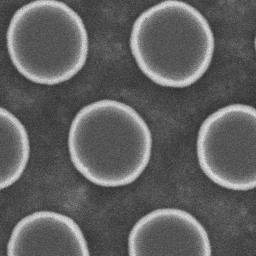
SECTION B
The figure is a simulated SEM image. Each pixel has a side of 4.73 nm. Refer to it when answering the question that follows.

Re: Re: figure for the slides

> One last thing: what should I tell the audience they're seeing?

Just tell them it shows raised bodies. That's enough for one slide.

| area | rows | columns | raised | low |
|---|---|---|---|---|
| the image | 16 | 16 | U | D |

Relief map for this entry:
DDUUDDDDDDUUDDDD
DUUUUDDDDUUUUDDD
DUUUUDDDUUUUUDDD
DUUUUDDDDUUUUDDD
DUUUUDDDDUUUUDDD
DDDDDDDDDDDDDDDD
DDDDDDUDDDDDDDDD
UDDDDUUUUDDDDUUU
UUDDUUUUUDDDDUUU
UUDDDUUUUDDDDUUU
UDDDDUUUUDDDDUUU
DDDDDDDDDDDDDDUU
DDDDDDDDDDDDDDDD
DDUUDDDDDUUUDDDD
DUUUUDDDUUUUUDDD
DUUUUDDDUUUUUDDD